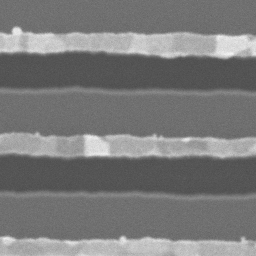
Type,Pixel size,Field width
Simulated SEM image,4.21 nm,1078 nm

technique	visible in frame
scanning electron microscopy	lines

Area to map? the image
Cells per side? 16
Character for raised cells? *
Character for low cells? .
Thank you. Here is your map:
****************
****************
****************
..........**.***
................
................
****************
****************
****************
****************
................
................
****************
****************
****************
****************